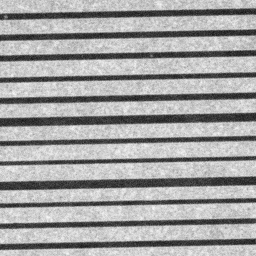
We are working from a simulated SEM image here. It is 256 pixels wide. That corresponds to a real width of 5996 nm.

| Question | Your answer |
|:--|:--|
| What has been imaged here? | parallel lines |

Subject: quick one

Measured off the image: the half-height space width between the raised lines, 170 nanometers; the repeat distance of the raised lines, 490 nanometres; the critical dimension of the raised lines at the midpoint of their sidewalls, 325 nm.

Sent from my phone